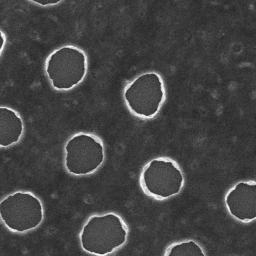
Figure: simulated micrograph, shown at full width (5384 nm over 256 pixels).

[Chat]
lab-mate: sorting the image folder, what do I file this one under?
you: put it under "holes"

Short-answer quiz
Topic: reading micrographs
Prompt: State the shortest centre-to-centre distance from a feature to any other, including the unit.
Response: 1720 nm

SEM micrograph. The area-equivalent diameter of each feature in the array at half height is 822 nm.